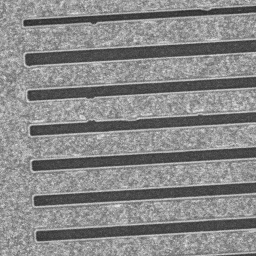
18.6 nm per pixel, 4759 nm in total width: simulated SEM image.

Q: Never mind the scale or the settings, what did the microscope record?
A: parallel lines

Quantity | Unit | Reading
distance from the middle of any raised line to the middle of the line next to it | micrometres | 0.665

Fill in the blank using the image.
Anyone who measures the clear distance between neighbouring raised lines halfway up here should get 220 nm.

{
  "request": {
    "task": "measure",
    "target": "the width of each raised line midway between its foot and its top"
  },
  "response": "438 nm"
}